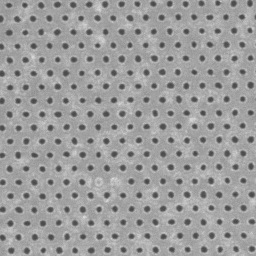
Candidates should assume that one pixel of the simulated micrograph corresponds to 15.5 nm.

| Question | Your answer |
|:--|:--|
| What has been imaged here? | a regular array of holes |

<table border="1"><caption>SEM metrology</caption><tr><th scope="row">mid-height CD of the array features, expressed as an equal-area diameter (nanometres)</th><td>106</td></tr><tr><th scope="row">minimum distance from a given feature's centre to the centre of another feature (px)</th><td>15.4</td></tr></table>